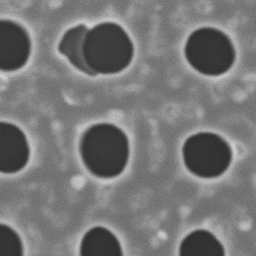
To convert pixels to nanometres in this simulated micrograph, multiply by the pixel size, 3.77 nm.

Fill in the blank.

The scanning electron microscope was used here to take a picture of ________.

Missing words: holes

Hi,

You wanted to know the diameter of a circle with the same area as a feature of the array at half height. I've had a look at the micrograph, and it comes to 193 nanometers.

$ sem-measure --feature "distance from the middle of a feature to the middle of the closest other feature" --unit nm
385